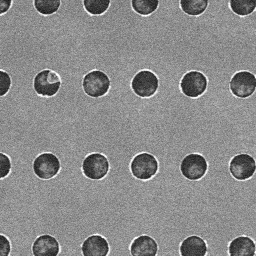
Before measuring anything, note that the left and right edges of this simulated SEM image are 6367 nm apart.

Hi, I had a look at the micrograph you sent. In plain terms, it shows a regular array of holes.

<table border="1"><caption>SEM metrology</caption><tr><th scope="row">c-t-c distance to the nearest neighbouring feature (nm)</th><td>1210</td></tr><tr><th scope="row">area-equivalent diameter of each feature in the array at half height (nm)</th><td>665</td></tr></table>